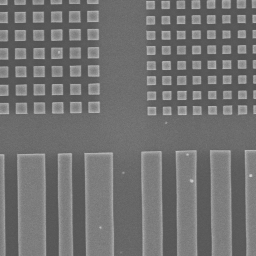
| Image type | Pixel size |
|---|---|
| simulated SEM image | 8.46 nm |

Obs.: groups of lines, slits or small figures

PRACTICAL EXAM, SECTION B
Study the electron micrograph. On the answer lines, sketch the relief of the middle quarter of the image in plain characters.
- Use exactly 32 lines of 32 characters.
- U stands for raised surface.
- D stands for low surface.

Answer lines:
DDDDDDDDDDDDDDDDDDDDDUUDDUUDDUDD
DDUUDDUUUDDDDDDDDDDDDDDDDDDDDDDD
DDUUDDUUUDDDDDDDDDDDDDDDDDDDDDDD
DDDDDDDDDDDDDDDDDDDDDUUDDUUDUUUD
DDDDDDDDDDDDDDDDDDDDDUUDDUUDUUUD
DDUUDDUUUDDDDDDDDDDDDDDDDDDDDDDD
DDUUDDUUUDDDDDDDDDDDDDDDDDDDDDDD
DDUDDDDDDDDDDDDDDDDDDUUDDUUDDUUD
DDDDDDDDDDDDDDDDDDDDDUUDDUUDDUUD
DDDDDDDDDDDDDDDDDDDDDDDDDDDDDDDD
DDUUDDUUUDDDDDDDDDDDDDDDDDDDDDDD
DDUUDDUUUDDDDDDDDDDDDUUDDUUDDUUD
DDDDDDDDDDDDDDDDDDDDDUUDDUUDDUUD
DDDDDDDDDDDDDDDDDDDDDDDDDDDDDDDD
DDDDDDDDDDDDDDDDDDDDDDDDDDDDDDDD
DDDDDDDDDDDDDDDDDDDDDDDDDDDDDDDD
DDDDDDDDDDDDDDDDDDDDDDDDDDDDDDDD
DDDDDDDDDDDDDDDDDDDDDDDDDDDDDDDD
DDDDDDDDDDDDDDDDDDDDDDDDDDDDDDDD
DDDDDDDDDDDDDDDDDDDDDDDDDDDDDDDD
DDDDDDDDDDDDDDDDDDDDDDDDDDDDDDDD
DDDDDDDDDDDDDDDDDDDDDDDDDDDDDDDD
DDDDDUUUUUUUDDDDDDDDUUUUDDDDUUUU
UUDDDUUUUUUUDDDDDDDDUUUUDDDDUUUU
UUDDDUUUUUUUDDDDDDDDUUUUDDDDUUUU
UUDDDUUUUUUUDDDDDDDDUUUUDDDDUUUU
UUDDDUUUUUUUDDDDDDDDUUUUDDDDUUUU
UUDDDUUUUUUUDDDDDDDDUUUUDDDDUUUU
UUDDDUUUUUUUDDDDDDDDUUUUDDDDUUUU
UUDDDUUUUUUUDDDDDDDDUUUUDDDDUUUU
UUDDDUUUUUUUDDDDDDDDUUUUDDDDUUUU
UUDDDUUUUUUUDDDDDDDDUUUUDDDDUUUU